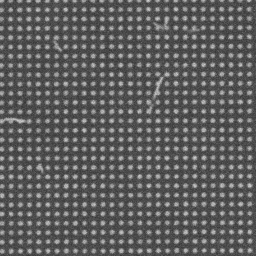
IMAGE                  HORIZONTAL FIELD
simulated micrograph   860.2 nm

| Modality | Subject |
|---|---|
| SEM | a regular array of raised bodies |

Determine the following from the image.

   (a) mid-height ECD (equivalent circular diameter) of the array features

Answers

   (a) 0.0147 micrometres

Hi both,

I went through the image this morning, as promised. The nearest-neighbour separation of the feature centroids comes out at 29.2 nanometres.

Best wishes